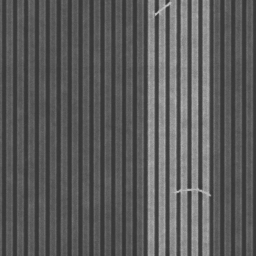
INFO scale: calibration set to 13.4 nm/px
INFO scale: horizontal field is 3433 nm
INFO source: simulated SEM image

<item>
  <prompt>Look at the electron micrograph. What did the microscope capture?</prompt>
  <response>parallel lines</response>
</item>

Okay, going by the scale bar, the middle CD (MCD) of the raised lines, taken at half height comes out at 78.8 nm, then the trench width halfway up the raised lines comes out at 65.4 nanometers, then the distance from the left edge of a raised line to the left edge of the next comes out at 146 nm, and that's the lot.